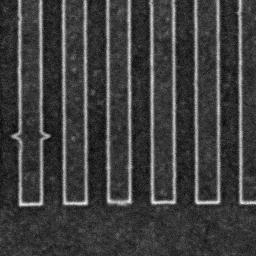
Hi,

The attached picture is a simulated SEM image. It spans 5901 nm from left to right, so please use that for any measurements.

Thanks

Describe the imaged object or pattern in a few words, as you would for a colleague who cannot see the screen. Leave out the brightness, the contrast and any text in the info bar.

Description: parallel lines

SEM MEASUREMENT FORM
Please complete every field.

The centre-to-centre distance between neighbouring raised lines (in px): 44.2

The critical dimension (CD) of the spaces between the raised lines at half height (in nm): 518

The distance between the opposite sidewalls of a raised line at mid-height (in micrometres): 0.501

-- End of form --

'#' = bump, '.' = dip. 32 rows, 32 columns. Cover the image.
..###...###..###...###..###...##
..###...###...##...###..###...##
..###...###...##...###..###...##
..###...###...##...###...##...##
..###...###...##...###...##...##
..###...###...##...###...##...##
..###...###...##...###...##...##
..###...###...##...###..###...##
..###...###...##...###...##...##
..###...###...##...###..###...##
..###...###...##...###..###...##
..###...###...##...###...##...##
..###...###...##...###...##...##
..###...###...##...###..###...##
..###...###...##...###..###...##
...##...###...##...###...##...##
..###...###...##...###...##...##
..###...###..###...###...##...##
...##...###...##...###...##...##
...##...###...##...###...##...##
...##...###..###...###...##...##
...##...###..###...###...##...##
...##...###...##...###...##...##
...##...###...##...###...##...##
...##...###...##...###...##...##
...##...........................
................................
................................
................................
................................
................................
................................